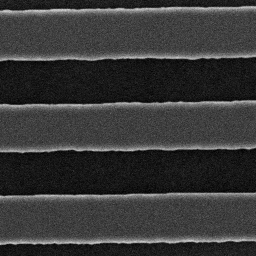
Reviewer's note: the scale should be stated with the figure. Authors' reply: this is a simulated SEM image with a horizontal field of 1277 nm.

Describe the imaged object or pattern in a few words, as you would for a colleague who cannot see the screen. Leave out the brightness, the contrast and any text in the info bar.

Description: lines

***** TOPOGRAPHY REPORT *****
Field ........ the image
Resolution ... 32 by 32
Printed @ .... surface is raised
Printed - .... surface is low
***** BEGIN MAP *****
--------------------------------
@@@@@@@@@@@@@@@@@@@@@@@@@@@@@@@@
@@@@@@@@@@@@@@@@@@@@@@@@@@@@@@@@
@@@@@@@@@@@@@@@@@@@@@@@@@@@@@@@@
@@@@@@@@@@@@@@@@@@@@@@@@@@@@@@@@
@@@@@@@@@@@@@@@@@@@@@@@@@@@@@@@@
@@@@@@@@@@@@@@@@@@@@@@@@@@@@@@@@
@@@@@@@---@@--------------------
--------------------------------
--------------------------------
--------------------------------
--------------------------------
--------------------------------
@@@@@@@@@@@@@@@@@@@@@@@@@@@@@@@@
@@@@@@@@@@@@@@@@@@@@@@@@@@@@@@@@
@@@@@@@@@@@@@@@@@@@@@@@@@@@@@@@@
@@@@@@@@@@@@@@@@@@@@@@@@@@@@@@@@
@@@@@@@@@@@@@@@@@@@@@@@@@@@@@@@@
@@@@@@@@@@@@@@@@@@@@@@@@@@@@@@@@
--------------------------------
--------------------------------
--------------------------------
--------------------------------
--------------------------------
----@@@@@@@@@@@@@@@@@@@@@@@@@@@@
@@@@@@@@@@@@@@@@@@@@@@@@@@@@@@@@
@@@@@@@@@@@@@@@@@@@@@@@@@@@@@@@@
@@@@@@@@@@@@@@@@@@@@@@@@@@@@@@@@
@@@@@@@@@@@@@@@@@@@@@@@@@@@@@@@@
@@@@@@@@@@@@@@@@@@@@@@@@@@@@@@@@
@@@-@@-@-@@@--------------------
--------------------------------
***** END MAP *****